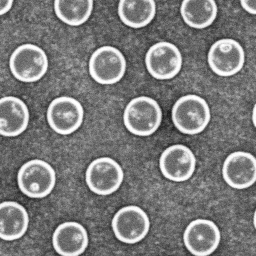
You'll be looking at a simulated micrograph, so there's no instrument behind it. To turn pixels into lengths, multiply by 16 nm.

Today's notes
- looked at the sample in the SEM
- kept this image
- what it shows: a regular array of raised bodies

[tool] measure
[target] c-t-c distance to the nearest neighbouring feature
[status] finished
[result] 908 nm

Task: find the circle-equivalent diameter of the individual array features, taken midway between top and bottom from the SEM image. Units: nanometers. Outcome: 540